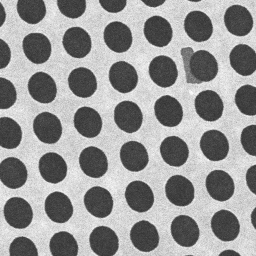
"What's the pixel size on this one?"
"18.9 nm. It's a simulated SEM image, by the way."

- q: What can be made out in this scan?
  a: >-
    a regular array of holes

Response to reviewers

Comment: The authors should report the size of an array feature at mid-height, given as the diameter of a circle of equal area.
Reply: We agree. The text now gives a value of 576 nanometres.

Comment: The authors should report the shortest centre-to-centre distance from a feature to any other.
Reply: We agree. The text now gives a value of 756 nanometres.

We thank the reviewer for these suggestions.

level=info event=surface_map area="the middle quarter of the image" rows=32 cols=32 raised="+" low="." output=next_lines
++++++++++++.....++++.......+++.
++.....++++.......+++.......++++
+......++++.......+++........+++
+.......+++........+++......++++
+.......++++......++++......++++
+.......++++......+++++....+++++
++......+++++....+++++++++++++++
++.....+++++++++++++++++++++++++
++++++++++++++++++++++++....++++
++++++++++++++....+++++......+++
+++++++++++++......+++.......+++
+++.....++++.......+++........++
+++......+++........+++.......++
++.......+++........+++.......++
++........+++.......++++.....+++
++........+++......++++++...++++
+++......+++++....++++++++++++++
++++.....+++++++++++++++++++++++
+++++++++++++++++++++++++....+++
++++++++++++++++...+++++......++
++++++++++++++......++++.......+
+++++....+++++.......+++.......+
++++......++++.......+++.......+
++++.......+++.......++++......+
++++.......+++.......++++......+
.+++.......++++......++++++..+++
.+++.......+++++....++++++++++++
.++++.....++++++++++++++++++++++
+++++++..+++++++++++++++++.....+
+++++++++++++++++...++++++......
++++++++++++++++.....++++.......
++++++.....++++.......+++.......